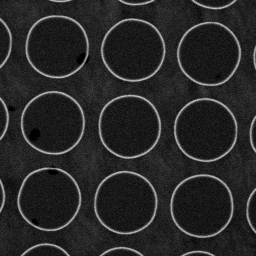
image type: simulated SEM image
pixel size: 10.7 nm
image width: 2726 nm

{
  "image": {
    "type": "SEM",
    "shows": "an array of small figures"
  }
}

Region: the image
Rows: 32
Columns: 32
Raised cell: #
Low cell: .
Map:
................##.......####...
................................
.....####.......#...............
#...######....######....####....
#..########..#######...######...
#..########..########.########..
#..########..########.########..
#...#######..#######..########..
....######...#######...#######..
......##......#####....######...
.........................###....
......#.........................
....#####.....####......###.....
#..#######...######....#####....
#..#######...#######..#######...
#..########.########..########.#
#..#######..########..########.#
...#######...#######..########.#
....#####....######...#######...
...............###.....#####....
................................
....####.......#................
...######....#####.....#####....
...#######..#######...#######...
#.########..########.########..#
..########..########.########..#
...#######..#######..########..#
...######...#######...#######..#
.....###.....#####....######...#
........................###.....
.....#..........................
...#####.....####.......##......